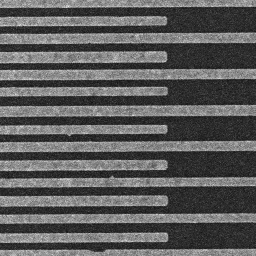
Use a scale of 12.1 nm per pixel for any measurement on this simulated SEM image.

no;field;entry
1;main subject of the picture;parallel lines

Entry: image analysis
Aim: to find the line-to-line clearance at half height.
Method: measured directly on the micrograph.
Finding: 101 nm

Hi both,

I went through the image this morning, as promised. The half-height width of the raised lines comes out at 0.11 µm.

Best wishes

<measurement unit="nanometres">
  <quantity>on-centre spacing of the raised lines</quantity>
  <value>216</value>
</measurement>